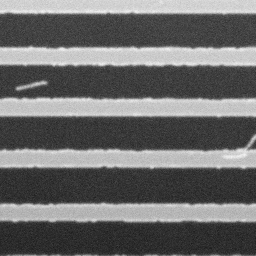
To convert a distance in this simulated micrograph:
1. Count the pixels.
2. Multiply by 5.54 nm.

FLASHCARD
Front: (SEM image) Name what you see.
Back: lines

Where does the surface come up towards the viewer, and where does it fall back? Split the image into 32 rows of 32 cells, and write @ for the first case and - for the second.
@@@@@@@@@@@@@@@@@@@@@@@@@@@@@@@@
@@@@@@@@@@@@@@@@@@@@@@@@@@@@@@@@
--------------------------------
--------------------------------
--------------------------------
--------------------------------
@@@@@@@@@@@@@@@@@@@@@@@@@@@@@@@@
@@@@@@@@@@@@@@@@@@@@@@@@@@@@@@@@
--------------------------------
--------------------------------
--------------------------------
--------------------------------
@@@@@@@@@@@@@@@@@@@@@@@@@@@@@@@@
@@@@@@@@@@@@@@@@@@@@@@@@@@@@@@@@
---------------------------@--@@
--------------------------------
--------------------------------
--------------------------------
--------------------------------
@@@@@@@@@@@@@@@@@@@@@@@@@@@@@@@@
@@@@@@@@@@@@@@@@@@@@@@@@@@@@@@@@
--------------------------------
--------------------------------
--------------------------------
--------------------------------
------------@-------------------
@@@@@@@@@@@@@@@@@@@@@@@@@@@@@@@@
@@@@@@@@@@@@@@@@@@@@@@@@@@@@@@@@
--------------------------------
--------------------------------
--------------------------------
--------------------------------